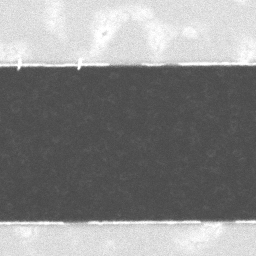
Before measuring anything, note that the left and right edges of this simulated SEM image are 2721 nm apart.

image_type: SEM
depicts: one or a few lines or trenches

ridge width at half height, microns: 1.7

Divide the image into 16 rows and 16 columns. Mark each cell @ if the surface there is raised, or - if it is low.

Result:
----------------
----------------
----------------
----------------
@@@@@@@@@@@@@@@@
@@@@@@@@@@@@@@@@
@@@@@@@@@@@@@@@@
@@@@@@@@@@@@@@@@
@@@@@@@@@@@@@@@@
@@@@@@@@@@@@@@@@
@@@@@@@@@@@@@@@@
@@@@@@@@@@@@@@@@
@@@@@@@@@@@@@@@@
@@@@@@@@@@@@@@@@
----------------
----------------